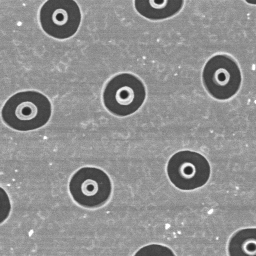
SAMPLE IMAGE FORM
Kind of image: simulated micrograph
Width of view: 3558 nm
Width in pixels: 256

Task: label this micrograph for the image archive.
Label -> ring-shaped grooves with a dot in the middle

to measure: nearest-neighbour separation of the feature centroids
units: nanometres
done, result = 1370